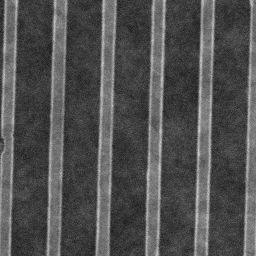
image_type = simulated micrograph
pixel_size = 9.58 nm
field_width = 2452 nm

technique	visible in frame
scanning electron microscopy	parallel lines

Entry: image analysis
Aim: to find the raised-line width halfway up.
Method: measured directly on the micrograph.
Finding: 112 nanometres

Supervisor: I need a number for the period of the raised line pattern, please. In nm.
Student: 471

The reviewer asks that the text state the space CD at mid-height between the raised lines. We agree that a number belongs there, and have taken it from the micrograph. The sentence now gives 363 nm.